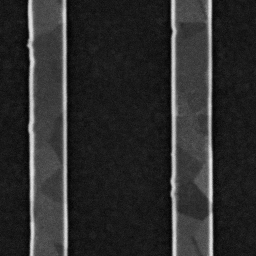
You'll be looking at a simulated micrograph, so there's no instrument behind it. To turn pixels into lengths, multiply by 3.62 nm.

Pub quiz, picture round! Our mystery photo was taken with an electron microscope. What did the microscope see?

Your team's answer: one or a few lines or trenches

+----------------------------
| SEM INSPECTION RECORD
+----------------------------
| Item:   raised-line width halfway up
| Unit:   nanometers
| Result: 131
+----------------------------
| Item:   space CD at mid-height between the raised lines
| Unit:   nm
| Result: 392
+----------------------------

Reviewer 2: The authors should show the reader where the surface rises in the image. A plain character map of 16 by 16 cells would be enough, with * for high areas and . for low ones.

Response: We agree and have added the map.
..**.......**...
..**.......**...
..**.......**...
..**.......**...
..**.......**...
..**.......**...
..**.......**...
..**.......**...
..**.......**...
..**.......**...
..**.......**...
..**.......**...
..**.......**...
..**.......**...
..**.......**...
..**.......**...